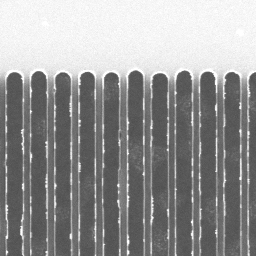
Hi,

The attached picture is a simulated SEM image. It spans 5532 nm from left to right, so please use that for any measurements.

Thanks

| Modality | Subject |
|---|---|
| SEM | parallel lines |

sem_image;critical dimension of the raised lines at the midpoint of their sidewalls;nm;386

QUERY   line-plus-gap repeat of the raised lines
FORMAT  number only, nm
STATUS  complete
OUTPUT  522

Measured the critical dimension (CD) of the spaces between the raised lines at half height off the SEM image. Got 135 nanometers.